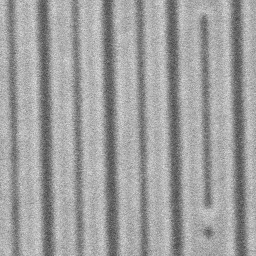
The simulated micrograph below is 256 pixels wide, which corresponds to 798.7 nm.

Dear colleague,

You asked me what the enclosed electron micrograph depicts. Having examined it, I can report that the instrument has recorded parallel lines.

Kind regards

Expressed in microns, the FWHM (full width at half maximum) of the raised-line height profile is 0.0527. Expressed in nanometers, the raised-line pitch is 100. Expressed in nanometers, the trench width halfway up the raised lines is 55.4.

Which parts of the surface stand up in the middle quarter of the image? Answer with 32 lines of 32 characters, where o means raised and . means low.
oo...oooo.....ooo....oooo.....oo
oo...oooo.....ooo....oooo.....oo
oo...oooo.....ooo....oooo.....oo
oo...oooo.....oooo...oooo.....oo
oo...oooo.....oooo...oooo.....oo
oo...oooo.....oooo...oooo.....oo
oo...oooo.....oooo...oooo.....oo
o....oooo.....oooo...oooo.....oo
o....oooo.....oooo...oooo.....oo
oo...oooo.....oooo...oooo.....oo
oo...oooo.....oooo...oooo.....oo
oo...oooo.....oooo...oooo.....oo
oo...oooo.....oooo...oooo.....oo
oo...oooo.....oooo...oooo.....oo
oo...oooo.....oooo...oooo.....oo
oo...oooo.....oooo...oooo.....oo
oo...oooo.....oooo...oooo.....oo
oo...oooo.....oooo...oooo.....oo
oo...oooo.....oooo...oooo.....oo
oo...oooo.....oooo...oooo.....oo
oo...oooo.....oooo...oooo.....oo
oo...oooo.....oooo...oooo.....oo
oo...oooo.....oooo...oooo.....oo
oo...oooo.....oooo...oooo.....oo
oo...oooo.....oooo...oooo.....oo
oo...oooo.....oooo...oooo.....oo
oo...oooo.....oooo...oooo.....oo
oo...oooo.....oooo...oooo.....oo
oo...oooo.....oooo...oooo.....oo
oo...oooo.....oooo...oooo.....oo
oo...oooo.....oooo...oooo.....oo
oo...oooo.....oooo....oooo....oo